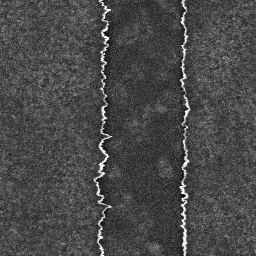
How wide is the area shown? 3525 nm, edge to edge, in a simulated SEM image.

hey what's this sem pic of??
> one or a few lines or trenches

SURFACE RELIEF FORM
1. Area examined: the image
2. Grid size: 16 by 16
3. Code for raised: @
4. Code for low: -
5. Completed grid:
@@@@@@@----@@@@@
@@@@@@@-----@@@@
@@@@@@@-----@@@@
@@@@@@-----@@@@@
@@@@@@-----@@@@@
@@@@@@-----@@@@@
@@@@@@@-----@@@@
@@@@@@------@@@@
@@@@@@@-----@@@@
@@@@@@------@@@@
@@@@@@------@@@@
@@@@@@-----@@@@@
@@@@@@-----@@@@@
@@@@@@-----@@@@@
@@@@@@------@@@@
@@@@@@------@@@@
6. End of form